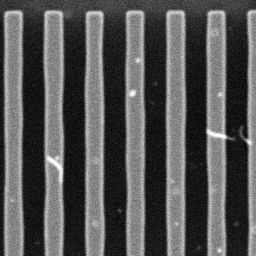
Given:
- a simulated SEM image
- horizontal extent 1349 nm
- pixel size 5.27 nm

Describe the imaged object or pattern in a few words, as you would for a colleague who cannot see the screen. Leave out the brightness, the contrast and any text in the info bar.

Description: groups of lines, slits or small figures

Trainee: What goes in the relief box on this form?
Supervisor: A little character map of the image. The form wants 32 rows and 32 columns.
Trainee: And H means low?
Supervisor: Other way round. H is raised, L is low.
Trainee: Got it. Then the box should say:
LLLLLLLLLLLLLLLLLLLLLLLLLLLLLLLL
LHLLLLHLLLLLLLLLHHLLLHHLLLHHLLLH
LHHLLLHHLLLHHLLLHHLLLHHLLLHHLLLH
LHHLLLHHLLLHHLLLHHLLLHHLLLHHLLLH
LHHLLLHHLLLHHLLLHHLLLHHLLLHHLLLH
LHHLLLHHLLLHHLLLHHLLLHHLLLHHLLLH
LHHLLLHHLLLHHLLLHHLLLHHLLLHHLLLH
LHHLLLHHLLLHHLLLHHLLLHHLLLHHLLLH
LHHLLLHHLLLHHLLLHHLLLHHLLLHHLLLH
LHHLLLHHLLLHHLLLHHLLLHHLLLHHLLLH
LHHLLLHHLLLHHLLLHHLLLHHLLLHHLLLH
LHHLLLHHLLLHHLLLHHLLLHHLLLHHLLLH
LHHLLLHHLLLHHLLLHHLLLHHLLLHHLLLH
LHHLLLHHLLLHHLLLHHLLLHHLLLHHLLLH
LHHLLLHHLLLHHLLLHHLLLHHLLLHHLLLH
LHHLLLHHLLLHHLLLHHLLLHHLLLHHLLLH
LHHLLLHHLLLHHLLLHHLLLHHLLLHHLLLH
LHHLLLHHLLLHHLLLHHLLLHHLLLHHLLLH
LHHLLLHHLLLHHLLLHHLLLHHLLLHHLLLH
LHHLLLHHLLLHHLLLHHLLLHHLLLHHLLLH
LHHLLLHHLLLHHLLLHHLLLHHLLLHHLLLH
LHHLLLHHLLLHHLLLHHLLLHHLLLHHLLLH
LHHLLLHHLLLHHLLLHHLLLHHLLLHHLLLH
LHHLLLHHLLLHHLLLHHLLLHHLLLHHLLLH
LHHLLLHHLLLHHLLLHHLLLHHLLLHHLLLH
LHHLLLHHLLLHHLLLHHLLLHHLLLHHLLLH
LHHLLLHHLLLHHLLLHHLLLHHLLLHHLLLH
LHHLLLHHLLLHHLLLHHLLLHHLLLHHLLLH
LHHLLLHHLLLHHLLLHHLLLHHLLLHHLLLH
LHHLLLHHLLLHHLLLHHLLLHHLLLHHLLLH
LHHLLLHHLLLHHLLLHHLLLHHLLLHHLLLH
LHHLLLHHLLLHHLLLHHLLLHHLLLHHLLLH